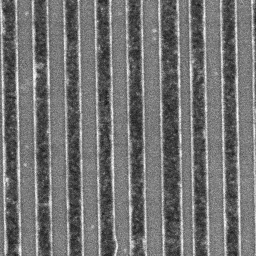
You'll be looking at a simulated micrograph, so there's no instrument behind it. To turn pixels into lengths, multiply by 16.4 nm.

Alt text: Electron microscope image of parallel lines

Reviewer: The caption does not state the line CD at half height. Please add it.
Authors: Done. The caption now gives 256 nm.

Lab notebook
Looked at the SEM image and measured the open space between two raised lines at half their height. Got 256 nm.